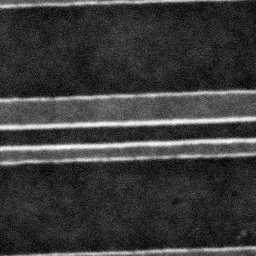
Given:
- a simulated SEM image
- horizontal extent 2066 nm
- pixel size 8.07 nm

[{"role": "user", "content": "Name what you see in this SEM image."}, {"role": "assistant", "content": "lines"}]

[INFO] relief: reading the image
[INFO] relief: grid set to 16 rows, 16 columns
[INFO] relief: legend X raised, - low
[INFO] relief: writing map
----------------
----------------
----------------
----------------
----------------
----------------
XXXXXXXXXXXXXXXX
XXXXXXXXXXXXXXXX
XXXXXXXXXXXXXXXX
XXXXXXXXXXXXXXXX
----------------
----------------
----------------
----------------
----------------
----------------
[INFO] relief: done